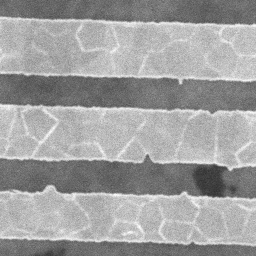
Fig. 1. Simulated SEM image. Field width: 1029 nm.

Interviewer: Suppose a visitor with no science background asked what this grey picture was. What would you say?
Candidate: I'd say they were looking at one or a few lines or trenches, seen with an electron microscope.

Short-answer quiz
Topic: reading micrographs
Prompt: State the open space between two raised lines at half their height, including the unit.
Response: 132 nanometres